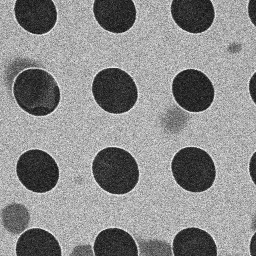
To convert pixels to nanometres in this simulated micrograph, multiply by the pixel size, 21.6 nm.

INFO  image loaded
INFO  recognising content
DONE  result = holes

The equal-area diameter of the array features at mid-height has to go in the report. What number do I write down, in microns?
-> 0.983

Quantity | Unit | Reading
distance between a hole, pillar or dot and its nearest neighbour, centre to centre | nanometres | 1690